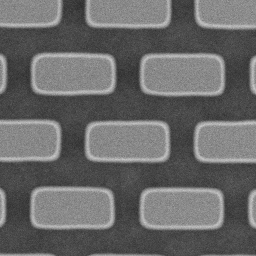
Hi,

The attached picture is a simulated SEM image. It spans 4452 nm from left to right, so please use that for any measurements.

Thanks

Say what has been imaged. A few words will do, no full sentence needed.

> groups of lines, slits or small figures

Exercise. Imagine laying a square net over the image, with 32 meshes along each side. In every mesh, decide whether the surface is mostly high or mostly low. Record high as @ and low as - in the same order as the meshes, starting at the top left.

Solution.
@@@@@@@@---@@@@@@@@@@----@@@@@@@
@@@@@@@@---@@@@@@@@@@----@@@@@@@
@@@@@@@----@@@@@@@@@@----@@@@@@@
--------------------------------
--------------------------------
--------------------------------
--------------------------------
----@@@@@@@@@@----@@@@@@@@@@----
@---@@@@@@@@@@----@@@@@@@@@@---@
@---@@@@@@@@@@----@@@@@@@@@@---@
@---@@@@@@@@@@----@@@@@@@@@@---@
-----@@@@@@@@@----@@@@@@@@@-----
--------------------------------
--------------------------------
--------------------------------
@@@@@@@-----@@@@@@@@-----@@@@@@@
@@@@@@@----@@@@@@@@@@----@@@@@@@
@@@@@@@----@@@@@@@@@@---@@@@@@@@
@@@@@@@----@@@@@@@@@@---@@@@@@@@
@@@@@@@----@@@@@@@@@@----@@@@@@@
--------------------------------
--------------------------------
--------------------------------
--------------------------------
----@@@@@@@@@@----@@@@@@@@@@---@
----@@@@@@@@@@----@@@@@@@@@@---@
----@@@@@@@@@@----@@@@@@@@@@---@
----@@@@@@@@@@----@@@@@@@@@@---@
--------------------@--@@@------
--------------------------------
--------------------------------
--------------------------------